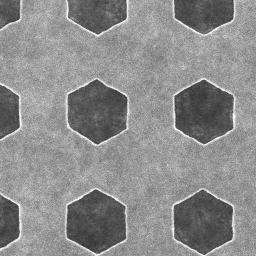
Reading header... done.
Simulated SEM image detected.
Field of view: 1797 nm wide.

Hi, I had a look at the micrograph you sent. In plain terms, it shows holes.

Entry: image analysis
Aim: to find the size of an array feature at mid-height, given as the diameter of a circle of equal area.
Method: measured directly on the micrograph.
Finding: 60.8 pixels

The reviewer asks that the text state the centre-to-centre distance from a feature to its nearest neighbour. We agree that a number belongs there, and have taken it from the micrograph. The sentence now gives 750 nanometres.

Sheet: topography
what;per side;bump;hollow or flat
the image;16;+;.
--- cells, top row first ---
.+++....+++....+
.++++..++++...++
++++++++++++++++
++++++++++++++++
++++++++++++++++
+++++..+++++..++
.+++....+++....+
.+++....+++....+
+++++..+++++..++
++++++++++++++++
++++++++++++++++
++++++++++++++++
.++++..+++++..++
.+++....+++....+
.+++....+++....+
+++++..+++++..++